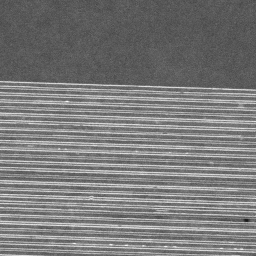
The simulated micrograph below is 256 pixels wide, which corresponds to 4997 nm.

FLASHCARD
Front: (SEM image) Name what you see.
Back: parallel lines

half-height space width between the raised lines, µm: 0.0878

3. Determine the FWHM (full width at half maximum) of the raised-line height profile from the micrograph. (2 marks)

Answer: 53.6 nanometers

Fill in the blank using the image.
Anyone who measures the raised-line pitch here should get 6.74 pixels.